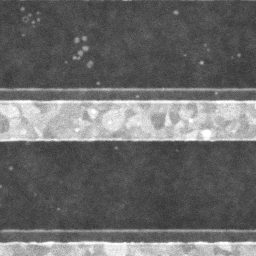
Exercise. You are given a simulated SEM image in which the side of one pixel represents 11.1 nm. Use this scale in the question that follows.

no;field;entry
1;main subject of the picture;lines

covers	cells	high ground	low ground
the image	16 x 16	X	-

----------------
----------------
----------------
----------------
----------------
----------------
XXXXXXXXXXXXXXXX
XXXXXXXXXXXXXXXX
XXXXXXXXXXXXXXXX
----------------
----------------
----------------
----------------
----------------
XXXXXXXXXXXXXXXX
XXXXXXXXXXXXXXXX